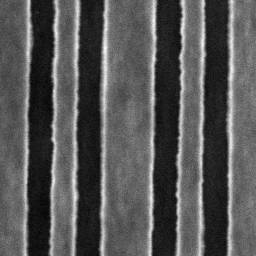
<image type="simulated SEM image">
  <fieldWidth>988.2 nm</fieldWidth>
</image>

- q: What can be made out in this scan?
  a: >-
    lines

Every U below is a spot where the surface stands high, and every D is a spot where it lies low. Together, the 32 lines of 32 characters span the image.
UUUUDDDUUUDDDUUUUUUDDDDUUDDDDUUU
UUUUDDDUUUDDDUUUUUUDDDDUUDDDDUUU
UUUUDDDUUUDDDUUUUUUDDDDUUDDDDUUU
UUUUDDDUUUDDDUUUUUUDDDDUUDDDDUUU
UUUUDDDUUUDDDUUUUUUDDDDUUDDDDUUU
UUUUDDDUUUDDDUUUUUUDDDDUUDDDDUUU
UUUUDDDUUUDDDUUUUUUDDDDUUDDDDUUU
UUUUDDDUUUDDDUUUUUUDDDDUUDDDDUUU
UUUUDDDUUUDDDUUUUUUDDDDUUDDDDUUU
UUUUDDDUUUDDDUUUUUUDDDDUUDDDDUUU
UUUUDDDUUUDDDUUUUUUDDDDUUDDDDUUU
UUUUDDDUUUDDDUUUUUUDDDDUUDDDDUUU
UUUUDDDUUUDDDUUUUUUDDDDUUDDDDUUU
UUUDDDDUUUDDDUUUUUUDDDDUUDDDDUUU
UUUDDDDUUUDDDUUUUUUDDDDUUDDDDUUU
UUUDDDDUUDDDDUUUUUUDDDUUUDDDDUUU
UUUDDDDUUDDDDUUUUUUDDDDUUDDDDUUU
UUUDDDDUUDDDDUUUUUUDDDUUUDDDDUUU
UUUDDDDUUUDDDUUUUUUDDDUUUDDDDUUU
UUUDDDDUUDDDDUUUUUUDDDUUUDDDDUUU
UUUDDDDUUUDDDUUUUUUDDDUUUDDDDUUU
UUUDDDDUUDDDDUUUUUUDDDUUUDDDDUUU
UUUDDDDUUDDDDUUUUUUDDDUUUDDDDUUU
UUUDDDUUUDDDDUUUUUUDDDUUUDDDDUUU
UUUDDDUUUUDDDUUUUUUDDDUUUDDDDUUU
UUUDDDUUUDDDDUUUUUUDDDUUUDDDDUUU
UUUDDDUUUDDDDUUUUUUDDDUUUDDDDUUU
UUUDDDDUUDDDDUUUUUUDDDUUUDDDDUUU
UUUDDDUUUDDDDUUUUUUDDDUUUDDDDUUU
UUUDDDUUUDDDDUUUUUUDDDUUUDDDDUUU
UUUDDDUUUDDDDUUUUUUDDDUUUDDDDUUU
UUUDDDUUUDDDDUUUUUUDDDUUUDDDDUUU